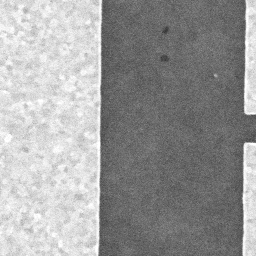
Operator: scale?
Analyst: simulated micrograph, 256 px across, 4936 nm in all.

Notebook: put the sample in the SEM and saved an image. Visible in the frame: wiring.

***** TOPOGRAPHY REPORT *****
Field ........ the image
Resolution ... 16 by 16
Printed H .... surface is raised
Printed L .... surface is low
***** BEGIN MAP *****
HHHHHHLLLLLLLLLH
HHHHHHLLLLLLLLLH
HHHHHHLLLLLLLLLH
HHHHHHLLLLLLLLLH
HHHHHHLLLLLLLLLH
HHHHHHLLLLLLLLLH
HHHHHHLLLLLLLLLH
HHHHHHLLLLLLLLLL
HHHHHHLLLLLLLLLL
HHHHHHLLLLLLLLLH
HHHHHHLLLLLLLLLH
HHHHHHLLLLLLLLLH
HHHHHHLLLLLLLLLH
HHHHHHLLLLLLLLLH
HHHHHHLLLLLLLLLH
HHHHHHLLLLLLLLLH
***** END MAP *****